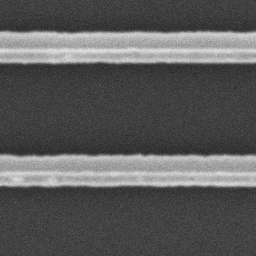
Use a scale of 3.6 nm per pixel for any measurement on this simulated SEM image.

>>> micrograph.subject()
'lines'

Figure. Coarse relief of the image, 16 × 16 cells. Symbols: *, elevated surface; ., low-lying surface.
................
................
****************
****************
................
................
................
................
................
................
****************
****************
................
................
................
................